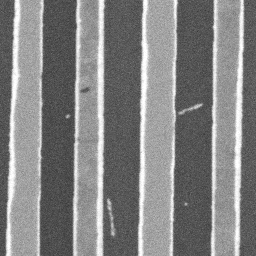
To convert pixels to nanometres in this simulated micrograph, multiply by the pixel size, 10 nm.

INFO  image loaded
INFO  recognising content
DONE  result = lines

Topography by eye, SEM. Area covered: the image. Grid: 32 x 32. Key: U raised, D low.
DDUUUDDDDDUUUDDDDDUUUUDDDDDUUUDD
DDUUUDDDDDUUUDDDDDUUUUDDDDDUUUDD
DDUUUDDDDDUUUDDDDDUUUUDDDDDUUUDD
DDUUUDDDDDUUUDDDDDUUUUDDDDDUUUDD
DDUUUDDDDDUUUDDDDDUUUUDDDDDUUUDD
DDUUUDDDDDUUUDDDDDUUUUDDDDDUUUDD
DDUUUDDDDDUUUDDDDDUUUUDDDDDUUUDD
DDUUUDDDDDUUUDDDDDUUUUDDDDDUUUDD
DDUUUDDDDDUUUDDDDDUUUUDDDDDUUUDD
DDUUUDDDDDUUUDDDDDUUUUDDDDDUUUDD
DDUUUDDDDDUUUDDDDDUUUUDDDDDUUUDD
DDUUUDDDDDUUUDDDDDUUUUDDDDDUUUDD
DDUUUDDDDDUUUDDDDDUUUUDDDDDUUUDD
DUUUUDDDDUUUUDDDDDUUUUDDDDDUUUDD
DUUUUDDDDUUUUDDDDDUUUUDDDDDUUUDD
DUUUUDDDDUUUUDDDDDUUUUDDDDDUUUDD
DUUUUDDDDUUUUDDDDDUUUUDDDDDUUUDD
DUUUUDDDDUUUUDDDDDUUUUDDDDDUUUDD
DUUUUDDDDUUUUDDDDDUUUUDDDDDUUUDD
DUUUUDDDDUUUUDDDDDUUUUDDDDDUUUDD
DUUUUDDDDUUUUDDDDDUUUUDDDDDUUUDD
DUUUUDDDDUUUUDDDDDUUUUDDDDDUUUDD
DUUUUDDDDUUUUDDDDDUUUUDDDDDUUUDD
DUUUUDDDDUUUUDDDDDUUUUDDDDDUUUDD
DUUUUDDDDUUUUDDDDDUUUUDDDDDUUUDD
DUUUUDDDDUUUUDDDDDUUUUDDDDDUUUDD
DUUUUDDDDUUUDDDDDDUUUUDDDDDUUUDD
DUUUUDDDDUUUDDDDDDUUUUDDDDDUUUDD
DUUUUDDDDUUUUDDDDDUUUUDDDDDUUUDD
DUUUUDDDDUUUUDDDDDUUUUDDDDUUUUDD
DUUUUDDDDUUUUDDDDDUUUUDDDDUUUUDD
DUUUUDDDDUUUDDDDDDUUUUDDDDDUUUDD